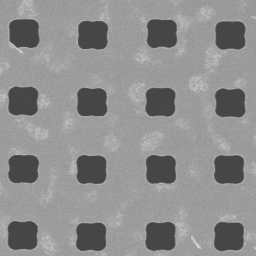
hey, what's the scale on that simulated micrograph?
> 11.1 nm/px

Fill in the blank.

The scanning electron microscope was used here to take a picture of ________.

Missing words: a regular array of holes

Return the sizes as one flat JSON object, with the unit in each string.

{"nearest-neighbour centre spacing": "746 nm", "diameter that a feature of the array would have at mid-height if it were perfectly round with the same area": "350 nm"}